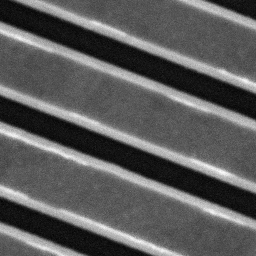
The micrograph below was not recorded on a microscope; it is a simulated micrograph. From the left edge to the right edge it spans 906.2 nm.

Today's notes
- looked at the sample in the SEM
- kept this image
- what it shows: one or a few lines or trenches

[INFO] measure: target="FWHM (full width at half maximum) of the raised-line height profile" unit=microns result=0.214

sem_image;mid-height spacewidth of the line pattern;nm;120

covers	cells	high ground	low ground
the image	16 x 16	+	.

...++++++++++...
.....+++++++++++
++......++++++++
+++++......+++++
+++++++......+++
++++++++++......
..+++++++++++...
.....++++++++++.
++.....+++++++++
++++......++++++
+++++++......+++
+++++++++......+
.+++++++++++....
....+++++++++++.
+......+++++++++
+++......+++++++